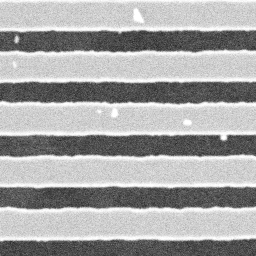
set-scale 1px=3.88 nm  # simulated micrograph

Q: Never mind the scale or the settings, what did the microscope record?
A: lines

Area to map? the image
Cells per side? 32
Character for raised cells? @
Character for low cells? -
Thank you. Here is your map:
@@@@@@@@@@@@@@@@@@@@@@@@@@@@@@@@
@@@@@@@@@@@@@@@@@@@@@@@@@@@@@@@@
@@@@@@@@@@@@@@@@@@@@@@@@@@@@@@@@
@@@@@@@@@@@@@@@@@@@@@@@@@@@@@@@@
--------------------------------
--------------------------------
-@@------@@@-----@@@-@@--@@@@@@@
@@@@@@@@@@@@@@@@@@@@@@@@@@@@@@@@
@@@@@@@@@@@@@@@@@@@@@@@@@@@@@@@@
@@@@@@@@@@@@@@@@@@@@@@@@@@@@@@@@
--------------------------------
--------------------------------
--------------------------------
@@@@@@@@@@@@@@@@@@@@@@@@@@@@@@@@
@@@@@@@@@@@@@@@@@@@@@@@@@@@@@@@@
@@@@@@@@@@@@@@@@@@@@@@@@@@@@@@@@
@@@@@@@@@@@@@@@@@@@@@@@@@@@@@@@@
--------------------------------
--------------------------------
------------------------------@-
@@@@@@@@@@@@@@@@@@@@@@@@@@@@@@@@
@@@@@@@@@@@@@@@@@@@@@@@@@@@@@@@@
@@@@@@@@@@@@@@@@@@@@@@@@@@@@@@@@
--------------------------------
--------------------------------
--------------------------------
@@@@@@@@@@@@@@@@@@@@@@@@@@@@@@@@
@@@@@@@@@@@@@@@@@@@@@@@@@@@@@@@@
@@@@@@@@@@@@@@@@@@@@@@@@@@@@@@@@
@@@@@@@@@@@@@@@@@@@@@@@@@@@@@@@@
--------------------------------
--------------------------------